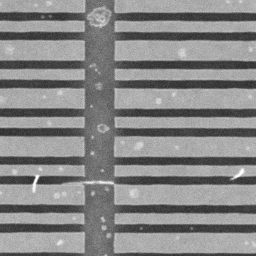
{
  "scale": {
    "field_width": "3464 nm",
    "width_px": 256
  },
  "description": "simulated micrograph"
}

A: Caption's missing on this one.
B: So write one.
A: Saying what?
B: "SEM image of groups of lines, slits or small figures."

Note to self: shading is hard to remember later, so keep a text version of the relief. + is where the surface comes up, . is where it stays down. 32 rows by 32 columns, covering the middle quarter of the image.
................................
................................
+++++........+++++++++++++++++++
+++++........+++++++++++++++++++
................................
................................
+++++........+++++++++++++++++++
+++++........+++++++++++++++++++
+++++........+++++++++++++++++++
+++++........+++++++++++++++++++
+++++........+++++++++++++++++++
................................
................................
+++++........+++++++++++++++++++
+++++........+++++++++++++++++++
+++++........+++++++++++++++++++
................................
................................
+++++........+++++++++++++++++++
+++++........+++++++++++++++++++
+++++........+++++++++++++++++++
+++++........+++++++++++++++++++
+++++........+++++++++++++++++++
................................
................................
+++..........+++++++..+..++++++.
+++++........+++++++++++++++++++
+++++........+++++++++++++++++++
................................
................................
+++++........++++.++.+++++++..++
+++++........+++++++++++++++++++